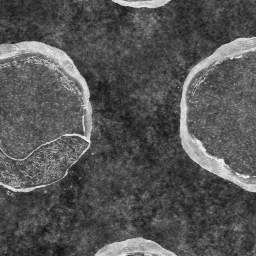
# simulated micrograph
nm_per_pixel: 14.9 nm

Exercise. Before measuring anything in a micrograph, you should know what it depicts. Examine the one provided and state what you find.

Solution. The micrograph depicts raised bodies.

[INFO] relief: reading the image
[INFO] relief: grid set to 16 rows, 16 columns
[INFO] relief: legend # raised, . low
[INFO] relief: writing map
................
................
................
####.........###
#####.......####
#####.......####
######.....#####
######.....#####
######......####
#####.......####
####.........###
###............#
................
................
................
........#.......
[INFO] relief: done